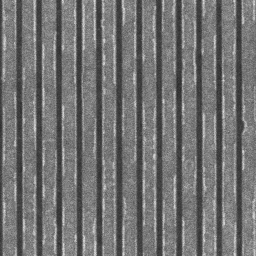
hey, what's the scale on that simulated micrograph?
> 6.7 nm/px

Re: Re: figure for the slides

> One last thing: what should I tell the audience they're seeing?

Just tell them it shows parallel lines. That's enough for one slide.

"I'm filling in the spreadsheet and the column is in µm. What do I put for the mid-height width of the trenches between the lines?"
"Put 0.0377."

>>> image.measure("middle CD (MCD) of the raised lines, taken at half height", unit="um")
0.0947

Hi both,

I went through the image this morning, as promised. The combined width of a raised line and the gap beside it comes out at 134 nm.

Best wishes